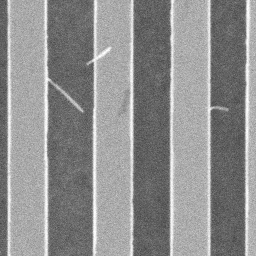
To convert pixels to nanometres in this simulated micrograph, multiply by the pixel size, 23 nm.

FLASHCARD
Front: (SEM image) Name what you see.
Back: lines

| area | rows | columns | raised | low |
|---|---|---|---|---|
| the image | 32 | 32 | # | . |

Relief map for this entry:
.#####......#####....#####.....#
.#####......#####....#####.....#
.#####......#####....#####.....#
.#####......#####....#####.....#
.#####......#####....#####.....#
.#####......#####....#####.....#
.#####......#####....#####.....#
.#####......#####....#####.....#
.#####......#####....#####.....#
.#####......#####....#####.....#
.#####......#####....#####.....#
.#####......#####....#####.....#
.#####......#####....#####.....#
.#####......#####....#####.....#
.#####......#####....#####.....#
.#####......#####....#####.....#
.#####......#####....#####.....#
.#####......#####....#####.....#
.#####......#####....#####.....#
.#####......#####....#####.....#
.#####......#####....#####.....#
.#####......#####....#####.....#
.#####......#####....#####.....#
.#####......#####....#####.....#
.#####......#####....#####.....#
.#####......#####....#####.....#
.#####......#####....#####.....#
.#####......#####....#####.....#
.#####......#####....#####.....#
.#####......####.....#####.....#
.#####......#####....#####.....#
.#####......#####....#####.....#